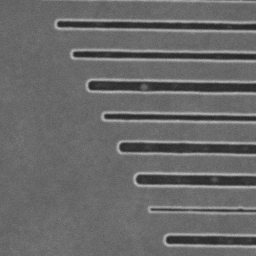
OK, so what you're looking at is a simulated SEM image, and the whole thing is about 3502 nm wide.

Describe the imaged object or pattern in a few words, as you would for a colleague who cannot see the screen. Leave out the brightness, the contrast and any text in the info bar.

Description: parallel lines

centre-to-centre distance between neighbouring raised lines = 418 nanometers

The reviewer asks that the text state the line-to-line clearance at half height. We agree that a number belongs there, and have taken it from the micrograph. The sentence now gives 116 nm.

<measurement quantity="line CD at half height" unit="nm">289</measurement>